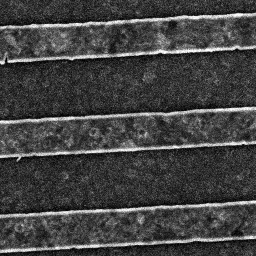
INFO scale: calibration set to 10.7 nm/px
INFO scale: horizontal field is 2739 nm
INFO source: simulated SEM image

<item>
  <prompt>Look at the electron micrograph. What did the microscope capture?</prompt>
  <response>one or a few lines or trenches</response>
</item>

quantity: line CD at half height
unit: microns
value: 0.374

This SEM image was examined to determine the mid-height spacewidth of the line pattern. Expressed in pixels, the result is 60.1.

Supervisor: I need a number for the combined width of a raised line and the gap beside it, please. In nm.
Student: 1010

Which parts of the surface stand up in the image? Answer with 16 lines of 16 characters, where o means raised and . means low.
................
......oooooooooo
oooooooooooooooo
oooooo..........
................
................
................
...ooooooooooooo
oooooooooooooooo
oooooo..........
................
................
................
.ooooooooooooooo
oooooooooooooooo
oooo............